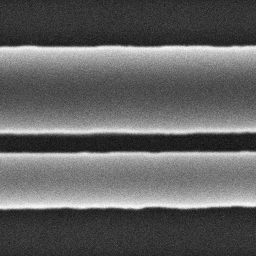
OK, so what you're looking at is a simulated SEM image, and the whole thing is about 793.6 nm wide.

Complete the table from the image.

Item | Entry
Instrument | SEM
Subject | lines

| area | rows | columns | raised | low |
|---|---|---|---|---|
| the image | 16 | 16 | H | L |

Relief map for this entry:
LLLLLLLLLLLLLLLL
LLLLLLLLLLLLLLLL
LLLLLLLLLLLLLLLL
HHHHHHHHHHHHHHHH
HHHHHHHHHHHHHHHH
HHHHHHHHHHHHHHHH
HHHHHHHHHHHHHHHH
HHHHHHHHHHHHHHHH
HHHHHHHHHHHHHHHH
HHHHHHHHHHHHHHHH
HHHHHHHHHHHHHHHH
HHHHHHHHHHHHHHHH
HHHHHHHHHHHHHHHH
LLLLLLLLLLLLLLLL
LLLLLLLLLLLLLLLL
LLLLLLLLLLLLLLLL